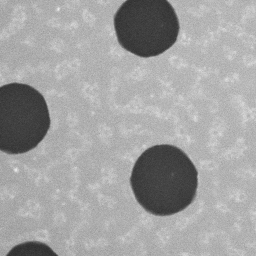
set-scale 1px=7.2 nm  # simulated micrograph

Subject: holes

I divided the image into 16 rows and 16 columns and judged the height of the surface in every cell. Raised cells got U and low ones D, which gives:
UUUUUUUDDDDUUUUU
UUUUUUUDDDDUUUUU
UUUUUUUDDDDUUUUU
UUUUUUUUUDUUUUUU
UUUUUUUUUUUUUUUU
DDUUUUUUUUUUUUUU
DDDUUUUUUUUUUUUU
DDDUUUUUUUUUUUUU
DDDUUUUUUUUUUUUU
DDUUUUUUUDDUUUUU
UUUUUUUUDDDDUUUU
UUUUUUUUDDDDUUUU
UUUUUUUUUDDDUUUU
UUUUUUUUUUUUUUUU
UUUUUUUUUUUUUUUU
UDDUUUUUUUUUUUUU